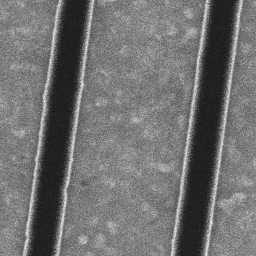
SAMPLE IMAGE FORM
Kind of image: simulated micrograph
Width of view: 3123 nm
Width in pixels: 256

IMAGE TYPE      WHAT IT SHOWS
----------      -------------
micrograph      one or a few lines or trenches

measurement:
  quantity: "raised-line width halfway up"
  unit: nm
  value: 428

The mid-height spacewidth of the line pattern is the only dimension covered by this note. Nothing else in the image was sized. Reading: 1370 nanometers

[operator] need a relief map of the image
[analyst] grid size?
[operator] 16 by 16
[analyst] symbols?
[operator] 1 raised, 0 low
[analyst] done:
0000110000000110
0001110000000110
0001110000000110
0001100000001110
0001100000001110
0001100000001100
0001100000001100
0001100000001100
0011100000001100
0011100000001100
0011000000011100
0011000000011100
0011000000011000
0011000000011000
0011000000011000
0011000000011000